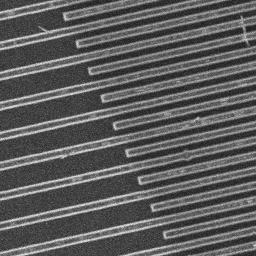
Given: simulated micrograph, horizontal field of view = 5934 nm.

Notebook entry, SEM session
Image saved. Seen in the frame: parallel lines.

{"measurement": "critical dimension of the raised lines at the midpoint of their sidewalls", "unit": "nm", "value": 147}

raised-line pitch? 340 nanometres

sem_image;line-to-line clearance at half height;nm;187